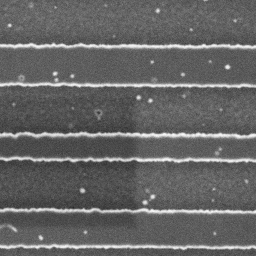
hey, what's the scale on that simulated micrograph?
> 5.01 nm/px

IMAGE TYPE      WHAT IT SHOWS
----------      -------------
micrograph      lines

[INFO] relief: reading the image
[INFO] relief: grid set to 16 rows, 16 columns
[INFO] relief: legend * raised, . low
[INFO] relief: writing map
................
................
................
****************
****************
................
................
................
****************
****************
................
................
................
****************
****************
..........**.***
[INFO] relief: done